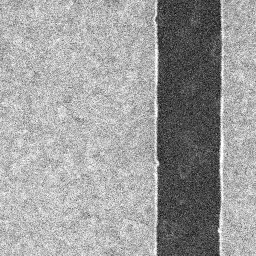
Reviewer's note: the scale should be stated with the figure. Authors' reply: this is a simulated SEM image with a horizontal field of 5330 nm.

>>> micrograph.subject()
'one or a few lines or trenches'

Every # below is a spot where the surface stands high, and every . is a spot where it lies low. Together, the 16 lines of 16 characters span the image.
##########....##
##########....##
##########....##
##########....##
##########....##
##########....##
##########....##
##########....##
##########....##
##########....##
##########....##
##########....##
##########....##
##########....##
##########....##
##########....##